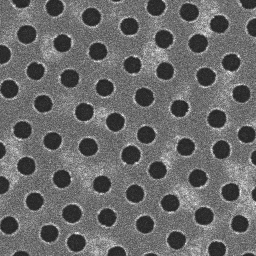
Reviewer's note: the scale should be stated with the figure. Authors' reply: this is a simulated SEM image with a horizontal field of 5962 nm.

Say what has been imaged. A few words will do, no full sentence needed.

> a regular array of holes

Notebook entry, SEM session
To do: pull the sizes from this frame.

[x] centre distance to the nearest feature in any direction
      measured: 769 nanometers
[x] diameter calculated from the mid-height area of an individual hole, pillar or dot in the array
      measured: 18.7 px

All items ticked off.